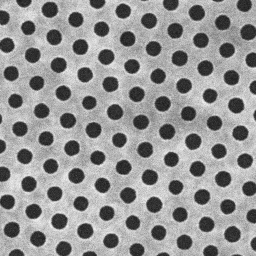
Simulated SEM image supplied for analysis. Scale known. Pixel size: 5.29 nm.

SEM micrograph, a regular array of holes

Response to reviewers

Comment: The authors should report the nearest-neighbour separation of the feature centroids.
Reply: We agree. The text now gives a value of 146 nm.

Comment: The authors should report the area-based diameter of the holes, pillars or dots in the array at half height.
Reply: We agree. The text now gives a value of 87.1 nanometres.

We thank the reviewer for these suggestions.